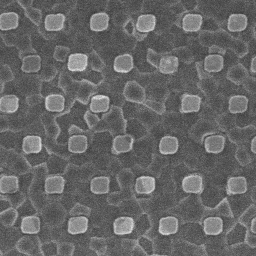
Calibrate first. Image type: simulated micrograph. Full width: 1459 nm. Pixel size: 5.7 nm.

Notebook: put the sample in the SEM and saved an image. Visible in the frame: a regular array of raised bodies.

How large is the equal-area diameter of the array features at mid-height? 107 nm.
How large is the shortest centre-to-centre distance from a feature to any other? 0.123 um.